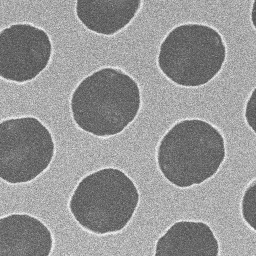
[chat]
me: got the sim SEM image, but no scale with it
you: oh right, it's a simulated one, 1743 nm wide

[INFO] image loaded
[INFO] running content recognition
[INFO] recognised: holes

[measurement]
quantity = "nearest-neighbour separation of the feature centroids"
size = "0.669 microns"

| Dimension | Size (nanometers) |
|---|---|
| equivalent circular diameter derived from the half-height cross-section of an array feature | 449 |